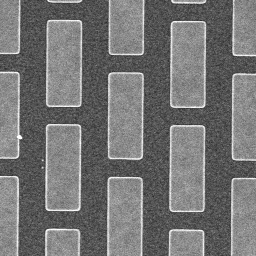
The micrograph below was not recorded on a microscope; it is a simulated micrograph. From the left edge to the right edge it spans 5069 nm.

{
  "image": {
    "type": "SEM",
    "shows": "groups of lines, slits or small figures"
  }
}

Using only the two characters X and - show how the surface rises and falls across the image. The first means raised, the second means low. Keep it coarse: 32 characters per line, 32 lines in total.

XX------------XXXX-----------XXX
XX------------XXXX-----------XXX
XX------------XXXX-----------XXX
XX----XXXX----XXXX---XXXXX---XXX
XX----XXXX----XXXX---XXXXX---XXX
XX----XXXX----XXXX---XXXXX---XXX
XX----XXXX----XXXX---XXXXX---XXX
------XXXX-----------XXXXX------
------XXXX-----------XXXXX------
XX----XXXX----XXXX---XXXXX---XXX
XX----XXXX----XXXX---XXXXX---XXX
XX----XXXX----XXXX---XXXXX---XXX
XX----XXXX----XXXX---XXXXX---XXX
XX------------XXXX-----------XXX
XX------------XXXX-----------XXX
XX------------XXXX-----------XXX
XX----XXXX----XXXX---XXXXX---XXX
XX----XXXX----XXXX---XXXXX---XXX
XX----XXXX----XXXX---XXXXX---XXX
XX----XXXX----XXXX---XXXXX---XXX
------XXXX-----------XXXXX------
------XXXX-----------XXXXX------
XX----XXXX----XXXX---XXXX----XXX
XX----XXXX---XXXXX---XXXX----XXX
XX----XXXX---XXXXX---XXXX----XXX
XX----XXXX---XXXXX---XXXX----XXX
XX-----------XXXXX------X----XXX
XX-----------XXXXX-----------XXX
XX-----------XXXXX-----------XXX
XX----XXXX---XXXXX---XXXX----XXX
XX----XXXX---XXXXX---XXXXX---XXX
XX----XXXX---XXXXX---XXXX----XXX